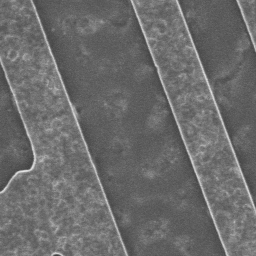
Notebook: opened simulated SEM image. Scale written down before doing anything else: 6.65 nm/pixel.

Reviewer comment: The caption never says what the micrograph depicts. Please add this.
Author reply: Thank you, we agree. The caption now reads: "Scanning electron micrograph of one or a few lines or trenches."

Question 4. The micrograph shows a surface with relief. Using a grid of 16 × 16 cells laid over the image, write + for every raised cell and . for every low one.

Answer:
++......+++....+
+++......+++...+
+++......+++....
+++.......++....
++++......+++...
.+++......+++...
.+++.......++...
.++++......+++..
..+++......+++..
..++++......+++.
..++++......+++.
.+++++.......++.
+++++++......+++
+++++++......+++
+++++++.......++
++++++++......++